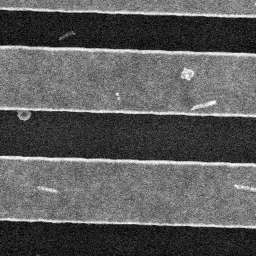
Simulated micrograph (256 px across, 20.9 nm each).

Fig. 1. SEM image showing lines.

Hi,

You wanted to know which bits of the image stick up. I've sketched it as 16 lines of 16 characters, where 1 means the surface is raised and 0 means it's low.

1111111111111111
0000000000000000
0000000000000000
1111111111111111
1111111111111111
1111111111111111
1111111111111111
0000000000000000
0000000000000000
0000000000000000
1111111111111111
1111111111111111
1111111111111111
1111111111111111
0000000000000000
0000000000000000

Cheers